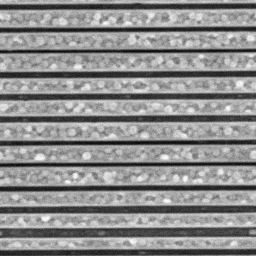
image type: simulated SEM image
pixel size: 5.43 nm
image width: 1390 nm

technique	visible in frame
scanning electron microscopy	parallel lines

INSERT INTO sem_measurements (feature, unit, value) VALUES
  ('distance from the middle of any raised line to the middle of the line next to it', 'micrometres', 0.122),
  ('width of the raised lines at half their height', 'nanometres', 90.3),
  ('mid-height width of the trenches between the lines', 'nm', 37.3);